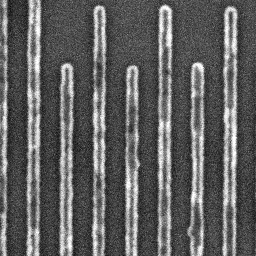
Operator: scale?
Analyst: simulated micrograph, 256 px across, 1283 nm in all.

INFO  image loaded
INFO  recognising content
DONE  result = parallel lines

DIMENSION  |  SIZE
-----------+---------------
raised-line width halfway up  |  0.0495 µm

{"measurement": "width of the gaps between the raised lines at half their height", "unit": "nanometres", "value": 114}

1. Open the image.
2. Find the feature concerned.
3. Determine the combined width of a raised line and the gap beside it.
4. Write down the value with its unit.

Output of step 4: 0.164 µm